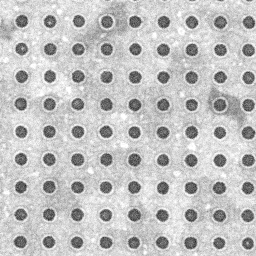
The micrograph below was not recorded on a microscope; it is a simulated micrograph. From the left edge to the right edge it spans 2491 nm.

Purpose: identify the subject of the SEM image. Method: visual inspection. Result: a regular array of holes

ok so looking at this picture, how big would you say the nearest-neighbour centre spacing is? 267 nanometres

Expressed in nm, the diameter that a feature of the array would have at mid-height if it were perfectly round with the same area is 133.